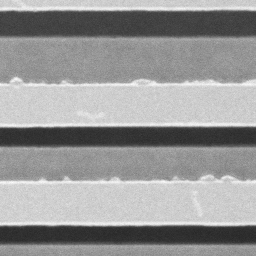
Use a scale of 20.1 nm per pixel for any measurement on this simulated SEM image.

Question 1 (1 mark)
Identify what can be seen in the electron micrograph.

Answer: lines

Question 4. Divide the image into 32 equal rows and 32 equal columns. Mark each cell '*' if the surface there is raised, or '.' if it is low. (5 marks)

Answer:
********************************
................................
................................
................................
................................
********************************
********************************
********************************
********************************
********************************
********************************
********************************
********************************
********************************
********************************
********************************
................................
................................
********************************
********************************
********************************
********************************
********************************
********************************
********************************
********************************
********************************
********************************
................................
................................
................................
********************************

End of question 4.